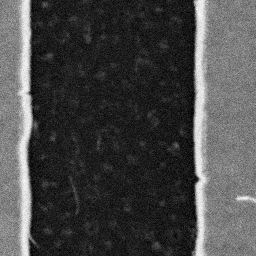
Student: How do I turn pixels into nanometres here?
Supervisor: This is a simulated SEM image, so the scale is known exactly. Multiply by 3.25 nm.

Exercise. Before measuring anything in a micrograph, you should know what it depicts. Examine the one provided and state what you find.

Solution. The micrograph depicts one or a few lines or trenches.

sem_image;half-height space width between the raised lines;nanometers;566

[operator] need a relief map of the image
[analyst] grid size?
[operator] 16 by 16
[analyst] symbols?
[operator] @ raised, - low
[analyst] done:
@@-----------@@@
@@-----------@@@
@@-----------@@@
@@----------@@@@
@@----------@@@@
@@-----------@@@
@@-----------@@@
@@----------@@@@
@@----------@@@@
@-----------@@@@
@@----------@@@@
@@-----------@@@
@@----------@@@@
@@-----------@@@
@@-----------@@@
@@----------@@@@